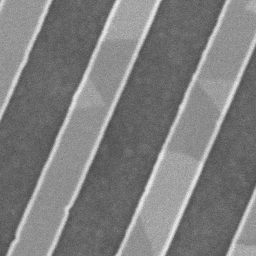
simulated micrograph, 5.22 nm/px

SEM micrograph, one or a few lines or trenches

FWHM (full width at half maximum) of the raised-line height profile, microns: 0.2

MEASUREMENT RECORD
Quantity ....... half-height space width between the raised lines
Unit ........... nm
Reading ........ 332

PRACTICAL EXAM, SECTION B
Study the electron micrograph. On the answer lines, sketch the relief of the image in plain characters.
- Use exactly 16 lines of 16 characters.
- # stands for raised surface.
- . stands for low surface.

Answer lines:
###....###....##
###....##.....##
##....###....###
##....##.....###
#....###....###.
#....###....###.
.....##....###..
....###....###..
....##.....##...
...###....###...
...##.....###...
..###....###....
..###....###....
..##....###....#
.###....###....#
.##.....##....##